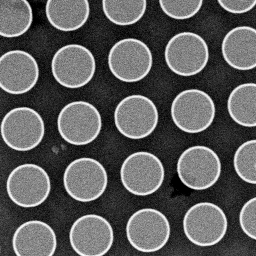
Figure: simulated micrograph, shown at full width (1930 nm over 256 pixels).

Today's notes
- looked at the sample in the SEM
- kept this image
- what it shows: an array of small figures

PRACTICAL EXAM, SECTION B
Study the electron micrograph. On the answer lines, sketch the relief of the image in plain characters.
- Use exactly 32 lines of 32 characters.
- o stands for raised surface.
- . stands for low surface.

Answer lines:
oooo..ooooo..ooooo..ooooo...oooo
oooo..ooooo..ooooo...oooo....o..
oooo..ooooo...ooo...............
oooo...ooo....................o.
.o....................ooo...oooo
...............ooo...ooooo..oooo
.oo....oooo...ooooo..ooooo..oooo
oooo...ooooo..ooooo..ooooo..oooo
ooooo..ooooo..ooooo..oooo.....o.
ooooo..ooooo..oooo..............
oooo....ooo....................o
.oo....................oo....ooo
...............oooo...oooo...ooo
..o.....oooo...oooo..oooooo..ooo
.oooo..ooooo..oooooo.oooooo..ooo
ooooo..oooooo..ooooo..oooo....oo
ooooo..ooooo...oooo.....o.......
.oooo...oooo....................
..oo....................oo....oo
................ooo....oooo..ooo
.........ooo...ooooo..oooooo.ooo
..oooo..ooooo..ooooo..ooooo...oo
.ooooo..ooooo..ooooo...oooo....o
.ooooo..ooooo...oooo....oo......
.ooooo...ooo....................
..ooo....................o.....o
.................ooo...ooooo..oo
..........ooo...ooooo..ooooo..oo
..oooo...ooooo..ooooo..ooooo..oo
..ooooo..ooooo..ooooo..ooooo...o
..ooooo..ooooo..ooooo....oo.....
..ooooo...ooo...................